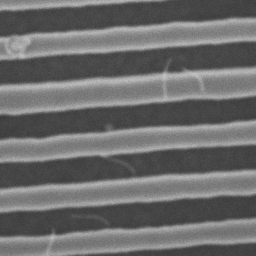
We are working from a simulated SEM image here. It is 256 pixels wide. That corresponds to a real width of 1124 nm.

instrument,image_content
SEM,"lines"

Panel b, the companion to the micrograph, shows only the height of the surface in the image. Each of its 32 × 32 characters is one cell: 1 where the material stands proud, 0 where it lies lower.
11111111111100000000000000000000
00000000000000000000000000000000
00000000000000000000000000001111
00000000000000111111111111111111
00111111111111111111111111111111
11111111111111111111111111100000
11111111111111000000000000000000
00000000000000000000000000000000
00000000000000000000000000000001
00000000000000000111111111111111
00001111111111111111111111111111
11111111111111111111111111111111
11111111111111111111111000000000
11111111110000000000000000000000
00000000000000000000000000000000
00000000000000000000000000001111
00000000000000111111111111111111
11111111111111111111111111111111
11111111111111111111111100000000
11111111110000000000000000000000
00000000000000000000000000000000
00000000000000000000000000001111
00000000000000011111111111111111
01111111111111111111111111111111
11111111111111111111111111100000
11111111111111100000000000000000
00000000000000000000000000000000
00000000000000000000000000000111
00000000000000000011111111111111
00000011111111111111111111111111
11111111111111111111111111000000
11111111111111100000000000000000